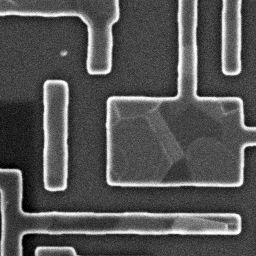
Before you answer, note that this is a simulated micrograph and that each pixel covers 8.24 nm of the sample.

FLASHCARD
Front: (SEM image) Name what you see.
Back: wiring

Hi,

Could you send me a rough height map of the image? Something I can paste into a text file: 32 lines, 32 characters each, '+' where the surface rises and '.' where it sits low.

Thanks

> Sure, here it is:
+++++++++++++++.......++....++..
+++++++++++++++.......++....++..
..........+++++.......++....++..
...........+++........++....++..
...........+++........++....++..
...........+++........++....++..
...........+++........++....++..
...........+++........++....++..
...........+++........++....++..
......................++........
......++..............++........
......++..............++........
......++......++++++++++++++++..
......++.....+++++++++++++++++..
......++.....+++++++++++++++++..
......++.....+++++++++++++++++..
......++.....+++++++++++++++++++
......++.....+++++++++++++++++++
......++.....++++++++++++++++++.
......++.....+++++++++++++++++..
......++.....+++++++++++++++++..
++....++.....+++++++++++++++++..
+++...++.....+++++++++++++++++..
+++...++........................
+++.............................
+++.............................
+++.............................
++++++++++++++++++++++++++++++..
++++++++++++++++++++++++++++++..
+++.............................
+++.............................
+++.+++++.......................